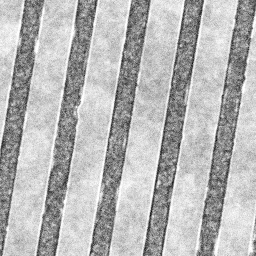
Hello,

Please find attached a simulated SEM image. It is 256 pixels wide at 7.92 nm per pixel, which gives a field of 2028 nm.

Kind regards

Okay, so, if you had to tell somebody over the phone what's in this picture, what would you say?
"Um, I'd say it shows parallel lines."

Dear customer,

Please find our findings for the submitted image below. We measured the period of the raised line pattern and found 416 nm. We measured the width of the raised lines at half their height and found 254 nm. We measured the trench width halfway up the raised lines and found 158 nanometers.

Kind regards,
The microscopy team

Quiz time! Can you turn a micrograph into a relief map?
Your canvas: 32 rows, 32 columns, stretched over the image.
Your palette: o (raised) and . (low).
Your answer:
ooo...oooo..oooo...oooo..ooooo..
ooo..oooo...oooo...oooo..oooo...
ooo..oooo...oooo...oooo..oooo...
ooo..oooo...oooo..ooooo..oooo...
oo...oooo...oooo..oooo...oooo...
oo...oooo..oooo...oooo...oooo..o
oo...oooo..oooo...oooo..ooooo..o
oo..oooo...oooo...oooo..oooo...o
oo..oooo...oooo...oooo..oooo...o
oo..oooo...oooo..oooo...oooo...o
o...oooo...oooo..oooo...oooo...o
o...oooo..oooo...oooo...oooo..oo
o...oooo..oooo...oooo..ooooo..oo
o..oooo...oooo...oooo..oooo...oo
o..oooo...oooo...oooo..oooo...oo
o..oooo...oooo..oooo...oooo...oo
...oooo...oooo..oooo...oooo...oo
...oooo..oooo...oooo...oooo..ooo
...oooo..oooo...oooo...oooo..ooo
..oooo...oooo...oooo..oooo...ooo
..oooo...oooo...oooo..oooo...ooo
..oooo...oooo..ooooo..oooo...ooo
..oooo...oooo..oooo...oooo...ooo
..oooo..ooooo..oooo...oooo..oooo
..oooo..oooo...oooo...oooo..oooo
.oooo...oooo...oooo..oooo...oooo
.oooo...oooo...oooo..oooo...oooo
.oooo...oooo..ooooo..oooo...oooo
.oooo...oooo..oooo...oooo...oooo
.oooo...oooo..oooo...oooo..ooooo
.oooo..oooo...oooo...oooo..oooo.
oooo...oooo...oooo..ooooo..oooo.